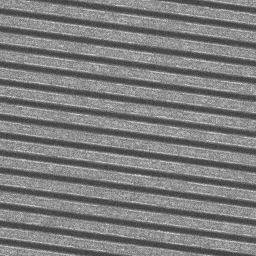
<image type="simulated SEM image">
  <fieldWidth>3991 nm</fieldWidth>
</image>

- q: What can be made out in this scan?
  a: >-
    parallel lines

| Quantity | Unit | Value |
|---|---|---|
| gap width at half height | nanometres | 104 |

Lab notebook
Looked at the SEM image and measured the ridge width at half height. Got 11.4 px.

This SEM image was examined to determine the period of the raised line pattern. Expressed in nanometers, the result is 273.